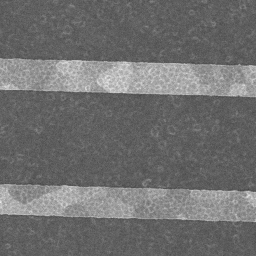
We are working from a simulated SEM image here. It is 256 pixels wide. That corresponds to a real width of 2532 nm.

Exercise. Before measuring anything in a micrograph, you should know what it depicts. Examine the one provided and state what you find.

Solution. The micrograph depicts one or a few lines or trenches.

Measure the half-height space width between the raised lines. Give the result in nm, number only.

941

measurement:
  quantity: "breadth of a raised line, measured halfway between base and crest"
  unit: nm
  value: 299